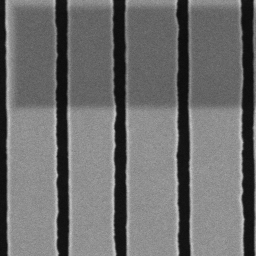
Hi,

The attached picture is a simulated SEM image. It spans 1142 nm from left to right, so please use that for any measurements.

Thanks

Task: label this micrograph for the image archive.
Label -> lines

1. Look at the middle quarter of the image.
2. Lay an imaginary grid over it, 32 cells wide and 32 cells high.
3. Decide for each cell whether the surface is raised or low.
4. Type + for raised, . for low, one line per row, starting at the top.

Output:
.+++++++++++...+++++++++++++...+
.+++++++++++...+++++++++++++...+
.+++++++++++...+++++++++++++...+
.+++++++++++...+++++++++++++...+
.+++++++++++...+++++++++++++...+
.+++++++++++...+++++++++++++...+
.+++++++++++...+++++++++++++...+
.+++++++++++...+++++++++++++...+
.++++++++++++..+++++++++++++...+
.++++++++++++..+++++++++++++...+
.++++++++++++..+++++++++++++...+
.++++++++++++..+++++++++++++...+
.++++++++++++..+++++++++++++...+
.++++++++++++..+++++++++++++...+
.++++++++++++..+++++++++++++...+
.+++++++++++...+++++++++++++...+
.++++++++++++..+++++++++++++...+
.++++++++++++..++++++++++++++..+
.++++++++++++..+++++++++++++...+
.++++++++++++..+++++++++++++...+
.++++++++++++...++++++++++++...+
.++++++++++++..+++++++++++++...+
.+++++++++++...+++++++++++++...+
.+++++++++++....++++++++++++...+
.+++++++++++....++++++++++++...+
.++++++++++++..+++++++++++++...+
.++++++++++++..+++++++++++++...+
.++++++++++++..+++++++++++++...+
.++++++++++++..+++++++++++++...+
.++++++++++++..++++++++++++++..+
.++++++++++++..+++++++++++++...+
.+++++++++++....++++++++++++...+